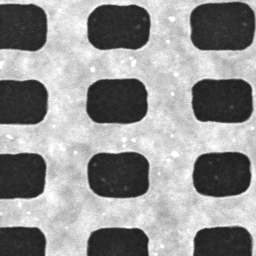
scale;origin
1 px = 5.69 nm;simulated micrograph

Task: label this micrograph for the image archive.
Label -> holes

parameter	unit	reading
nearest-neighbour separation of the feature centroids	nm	421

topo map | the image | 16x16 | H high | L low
LLHHHHLLLHHHLLLL
LLLHHLLLLHHHLLLL
LLLHHHLLLHHHLLLL
HHHHHHHHHHHHHHHH
HHHHHHHHHHHHHHHH
LLLHHHLLLHHHLLLL
LLLHHLLLLHHHLLLL
LLLHHHLLLHHHHLLH
HHHHHHHHHHHHHHHH
HHHHHHHHHHHHHLLH
LLLHHLLLLHHHLLLL
LLLHHHLLLHHHLLLL
HHHHHHHHHHHHHHHH
HHHHHHHHHHHHHHHH
LLLHHHLLLHHHLLLH
LLLHHLLLLHHHLLLL